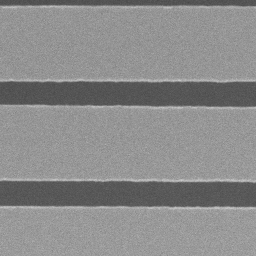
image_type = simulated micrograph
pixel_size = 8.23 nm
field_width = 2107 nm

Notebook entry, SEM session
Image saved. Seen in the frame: lines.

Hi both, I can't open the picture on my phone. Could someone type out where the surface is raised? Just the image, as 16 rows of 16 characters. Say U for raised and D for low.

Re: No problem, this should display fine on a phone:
UUUUUUUUUUUUUUUU
UUUUUUUUUUUUUUUU
UUUUUUUUUUUUUUUU
UUUUUUUUUUUUUUUU
UUUUUUUUUUUUUUUU
DDDDDDDDDDDDDDDD
DDDDDDDDDDDDDDDD
UUUUUUUUUUUUUUUU
UUUUUUUUUUUUUUUU
UUUUUUUUUUUUUUUU
UUUUUUUUUUUUUUUU
DDDDDDDDDDDDDDDD
DDDDDDDDDDDDDDDD
UUUUUUUUUUUUUUUU
UUUUUUUUUUUUUUUU
UUUUUUUUUUUUUUUU